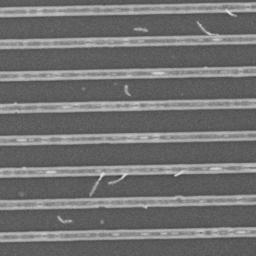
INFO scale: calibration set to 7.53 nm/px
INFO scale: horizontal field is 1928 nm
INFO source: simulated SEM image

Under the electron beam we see parallel lines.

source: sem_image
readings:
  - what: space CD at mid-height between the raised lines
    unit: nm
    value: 183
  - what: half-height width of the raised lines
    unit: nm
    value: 61.1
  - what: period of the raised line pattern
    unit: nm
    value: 242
